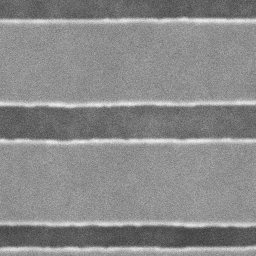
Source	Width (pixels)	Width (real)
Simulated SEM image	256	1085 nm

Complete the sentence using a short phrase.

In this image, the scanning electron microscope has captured lines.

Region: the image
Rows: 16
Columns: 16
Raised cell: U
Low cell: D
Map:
DDDDDDDDDDDDDDDD
UUUUUUUUUUUUUUUU
UUUUUUUUUUUUUUUU
UUUUUUUUUUUUUUUU
UUUUUUUUUUUUUUUU
UUUUUUUUUUUUUUUU
UUUUUUUUUDUUUDDD
DDDDDDDDDDDDDDDD
DDDDDDDDDDDDDDDD
UUUUUUUUUUUUUUUU
UUUUUUUUUUUUUUUU
UUUUUUUUUUUUUUUU
UUUUUUUUUUUUUUUU
UUUUUUUUUUUUUUUU
DDDDDDDDDDDDDDDD
DDDDDDDDDDDDDDDU